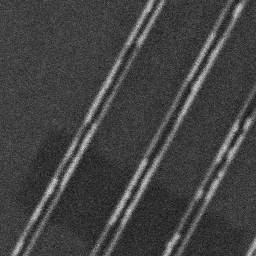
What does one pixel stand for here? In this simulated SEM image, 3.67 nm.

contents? one or a few lines or trenches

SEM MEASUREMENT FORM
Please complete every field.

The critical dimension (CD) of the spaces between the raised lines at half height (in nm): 212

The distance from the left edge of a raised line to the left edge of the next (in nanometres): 251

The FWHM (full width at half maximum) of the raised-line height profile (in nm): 47.6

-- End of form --